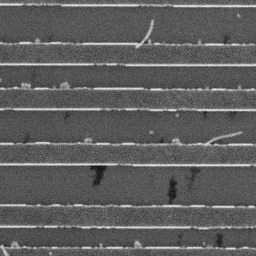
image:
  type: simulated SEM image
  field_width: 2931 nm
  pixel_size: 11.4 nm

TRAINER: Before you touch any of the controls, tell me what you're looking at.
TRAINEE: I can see lines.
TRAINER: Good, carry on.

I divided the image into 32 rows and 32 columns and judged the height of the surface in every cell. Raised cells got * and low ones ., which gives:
...*****************************
................................
................................
................................
................................
**********.......**.............
********************************
********************************
................................
................................
................................
********************************
********************************
********************************
................................
................................
................................
................................
********************************
********************************
...............*****************
................................
................................
................................
................................
................................
********************************
********************************
................................
................................
................................
********************************